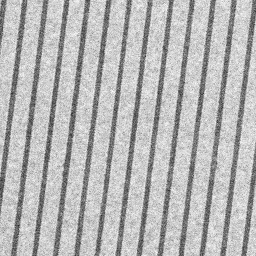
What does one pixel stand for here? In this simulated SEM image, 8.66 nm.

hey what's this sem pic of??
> parallel lines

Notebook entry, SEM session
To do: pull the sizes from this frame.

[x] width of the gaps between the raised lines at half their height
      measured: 6.32 px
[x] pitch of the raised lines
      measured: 180 nanometers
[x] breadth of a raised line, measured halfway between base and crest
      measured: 0.126 um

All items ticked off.